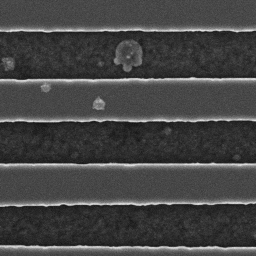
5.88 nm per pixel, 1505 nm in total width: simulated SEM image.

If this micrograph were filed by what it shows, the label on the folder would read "lines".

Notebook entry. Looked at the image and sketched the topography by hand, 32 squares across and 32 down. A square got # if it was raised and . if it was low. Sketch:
################################
################################
################################
################################
................................
................................
................................
................................
................................
................................
################################
################################
################################
################################
################################
................................
................................
................................
................................
................................
#.########..####.###############
################################
################################
################################
################################
######################..###...#.
................................
................................
................................
................................
................................
################################